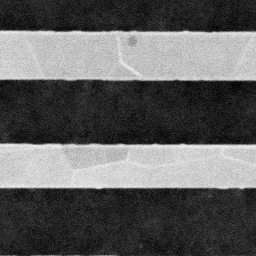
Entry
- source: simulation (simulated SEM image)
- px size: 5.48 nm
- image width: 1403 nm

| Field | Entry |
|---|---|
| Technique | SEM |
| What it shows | lines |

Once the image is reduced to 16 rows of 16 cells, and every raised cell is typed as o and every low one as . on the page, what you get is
................
................
oooooooooooooooo
oooooooooooooooo
oooooooooooooooo
................
................
................
................
oooooooooooooooo
oooooooooooooooo
oooooooooooooooo
................
................
................
................